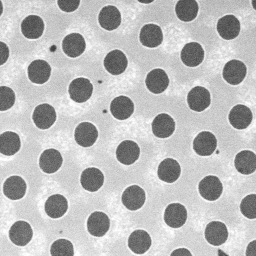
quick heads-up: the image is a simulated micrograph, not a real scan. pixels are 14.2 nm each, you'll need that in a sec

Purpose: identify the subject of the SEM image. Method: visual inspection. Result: a regular array of holes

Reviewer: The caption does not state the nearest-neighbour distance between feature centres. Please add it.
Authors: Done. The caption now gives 44.5 pixels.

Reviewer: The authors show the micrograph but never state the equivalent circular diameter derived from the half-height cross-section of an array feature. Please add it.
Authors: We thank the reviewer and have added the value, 356 nanometers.